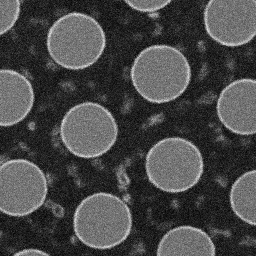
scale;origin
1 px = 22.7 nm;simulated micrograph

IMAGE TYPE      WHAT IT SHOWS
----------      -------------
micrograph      raised bodies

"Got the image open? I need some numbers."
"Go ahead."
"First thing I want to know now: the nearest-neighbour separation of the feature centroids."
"2070 nanometres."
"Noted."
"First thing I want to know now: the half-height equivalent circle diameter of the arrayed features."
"1260 nanometres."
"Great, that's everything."